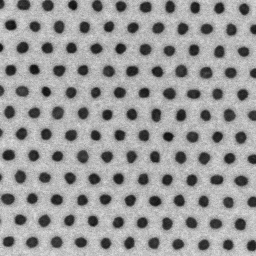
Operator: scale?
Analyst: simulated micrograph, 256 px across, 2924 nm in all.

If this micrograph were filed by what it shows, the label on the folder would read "a regular array of holes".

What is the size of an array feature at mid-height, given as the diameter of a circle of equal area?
0.128 microns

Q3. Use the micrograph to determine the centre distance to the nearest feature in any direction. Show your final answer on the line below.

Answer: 274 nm